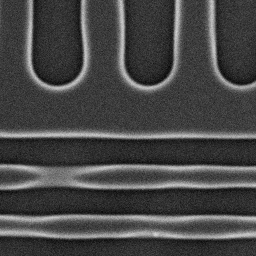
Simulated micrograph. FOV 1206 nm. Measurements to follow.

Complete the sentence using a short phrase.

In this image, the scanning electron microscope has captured groups of lines, slits or small figures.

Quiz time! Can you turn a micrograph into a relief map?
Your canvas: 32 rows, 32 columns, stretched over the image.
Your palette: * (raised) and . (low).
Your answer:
****......*****.......*****.....
****......*****.......*****.....
****......*****.......*****.....
****......*****.......*****.....
****......*****.......*****.....
****......*****.......*****.....
****.......****.......*****.....
****.......****.......*****.....
****......******......*****.....
****......******.....*******....
******...********...*********..*
********************************
********************************
********************************
********************************
********************************
********************************
................................
................................
................................
................................
********************************
********************************
**..............................
................................
................................
................................
********************************
********************************
......**********.....*********..
................................
................................